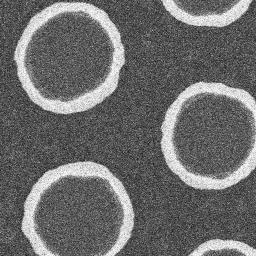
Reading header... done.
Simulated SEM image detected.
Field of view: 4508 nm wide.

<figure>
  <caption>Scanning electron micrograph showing raised bodies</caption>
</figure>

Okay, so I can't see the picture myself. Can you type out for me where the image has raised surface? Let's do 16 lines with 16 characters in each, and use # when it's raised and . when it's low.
....##.....####.
..#####.........
..#####.........
.######.........
.######.........
..#####.........
...##......#####
...........#####
..........######
..........######
...........####.
...####......#..
..######........
..######........
..######........
...####......##.